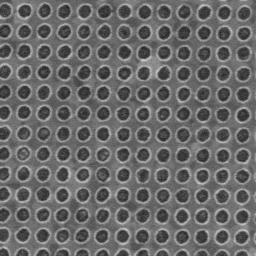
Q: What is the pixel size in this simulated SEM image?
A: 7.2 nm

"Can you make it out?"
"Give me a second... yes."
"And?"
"a regular array of holes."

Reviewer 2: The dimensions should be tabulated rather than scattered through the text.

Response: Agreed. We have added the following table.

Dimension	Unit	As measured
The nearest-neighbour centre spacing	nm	142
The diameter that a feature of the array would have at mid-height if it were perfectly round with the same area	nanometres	102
